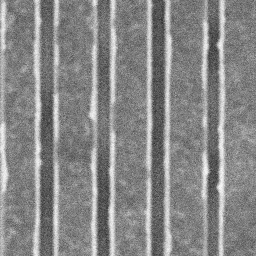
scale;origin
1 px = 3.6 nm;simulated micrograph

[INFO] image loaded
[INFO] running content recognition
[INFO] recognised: parallel lines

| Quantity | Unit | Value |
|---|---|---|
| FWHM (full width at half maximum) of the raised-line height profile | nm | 148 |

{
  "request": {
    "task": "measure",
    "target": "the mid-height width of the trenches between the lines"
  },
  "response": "51.7 nanometers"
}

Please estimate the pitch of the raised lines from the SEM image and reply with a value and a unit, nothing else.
55.2 pixels